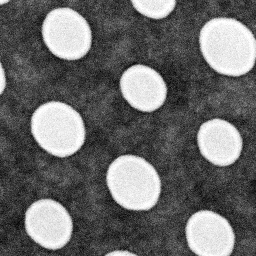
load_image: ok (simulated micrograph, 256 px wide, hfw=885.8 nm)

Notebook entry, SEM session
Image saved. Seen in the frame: raised bodies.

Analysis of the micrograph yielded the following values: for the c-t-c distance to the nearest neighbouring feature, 324 nanometres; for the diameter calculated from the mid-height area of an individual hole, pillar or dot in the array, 159 nm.